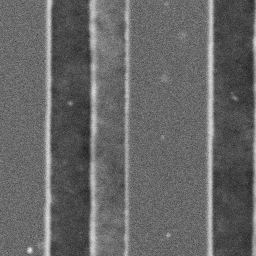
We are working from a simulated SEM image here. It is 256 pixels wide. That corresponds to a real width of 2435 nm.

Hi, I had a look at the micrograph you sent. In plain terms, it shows lines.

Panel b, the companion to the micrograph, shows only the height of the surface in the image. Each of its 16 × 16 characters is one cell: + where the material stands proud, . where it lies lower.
+++.....+++++...
+++.....+++++...
+++.....+++++...
+++.....+++++...
+++.....+++++...
+++.....+++++...
+++.....+++++...
+++.....+++++...
+++.....+++++...
+++.....+++++...
+++.....+++++...
+++.....+++++...
+++.....+++++...
+++.....+++++...
+++.....+++++...
+++.....+++++...